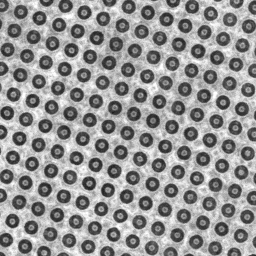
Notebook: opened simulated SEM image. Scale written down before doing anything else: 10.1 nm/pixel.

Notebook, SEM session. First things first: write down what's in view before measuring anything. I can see a regular array of ring-shaped grooves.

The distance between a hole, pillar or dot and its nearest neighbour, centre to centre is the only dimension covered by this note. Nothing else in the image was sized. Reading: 200 nanometers